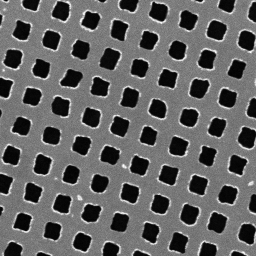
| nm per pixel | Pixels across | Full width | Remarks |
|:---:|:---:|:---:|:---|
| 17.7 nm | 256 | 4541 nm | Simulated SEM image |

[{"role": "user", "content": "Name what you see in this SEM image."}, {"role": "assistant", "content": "a regular array of holes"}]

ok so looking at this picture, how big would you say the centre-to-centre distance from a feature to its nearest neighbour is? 529 nanometers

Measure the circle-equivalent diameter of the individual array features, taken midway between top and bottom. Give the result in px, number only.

18.5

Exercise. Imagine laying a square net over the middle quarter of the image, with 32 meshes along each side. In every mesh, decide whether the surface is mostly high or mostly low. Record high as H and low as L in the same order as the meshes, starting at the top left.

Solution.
HHHHHHHHHLLLLHHHHLLLLHHHHHHHHHHH
HLHHHHHHHHHHHHHHHLLLLHHHHLHHHHHH
HLLLLHHHHHHHHHHHHLLLHHHHLLLLHHHH
LLLLLHHHLHHHHHHHHHHHHHHHLLLLHHHH
LLLLHHHLLLLHHHHHHHHHHHHLLLLLHHHH
LLLHHHHLLLLHHHHHHHHHHHHHHLLLHHHH
HHHHHHHLLLLHHHHLLLHHHHHHHHHHHHHL
HHHHHHHLLLLHHHHLLLLHHHHHHHHHHHHL
HHHHHHHHHHHHHHHLLLHHHHHHHHHHHHHH
LHHHHHHHHHHHHHLLLLHHHHLLLHHHHHHH
LHHHHHHHHHHHHHHLLLHHHLLLLHHHHHHH
LHHHHLLLHHHHHHHHHHHHHLLLLLHHHHLL
LHHHHLLLLHHHHHHHHHHHHHLLLHHHHHLL
HHHHHLLLLHHHLLLHHHHHHHHHLHHHHLLL
HHHHHLLLLHHHLLLLHHHHHHHHHHHHHLLL
HHHHHHLLHHHHLLLLHHHHHHHHHHHHHHLL
HHHHHHHHHHHHLLLLHHHHLLLHHHHHHHHH
HHHHHHHHHHHHLLLHHHHLLLLHHHHHHHHH
HHHLLLHHHHHHHHHHHHHLLLLHHHHLLHHH
HHHLLLLHHHHHHHHHHHHLLLLHHHHLLLLH
HHLLLLLHHHHHHHHHHHHHHHHHHHLLLLLH
HHLLLLHHHHLLLLHHHHHHHHHHHHLLLLLH
HHHHLLHHHLLLLLHHHHHHHHHHHHHLLLHH
HHHHHHHHHLLLLLHHHLLHHHHHHHHHHHHH
HHHHHHHHHHLLLHHHHLLLLHHHHHHHHHHH
HLLHHHHHHHHHHHHHHLLLLHHHHLHHHHHH
LLLLHHHHHHHHHHHHHLLLLHHHLLLLLHHH
LLLLHHHHHHHHHHHHHHLLHHHHLLLLHHHH
LLLLHHHLLLLHHHHHHHHHHHHHLLLLHHHH
LLLHHHHLLLLHHHHHHHHHHHHHHLLLHHHH
HHHHHHHLLLLHHHHLLLHHHHHHHHHHHHHL
HHHHHHHLLLHHHHLLLLLHHHHHHHHHHHHL